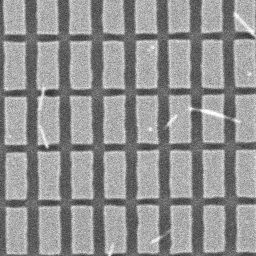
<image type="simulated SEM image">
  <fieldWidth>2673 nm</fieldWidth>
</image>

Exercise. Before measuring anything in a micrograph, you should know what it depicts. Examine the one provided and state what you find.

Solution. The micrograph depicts groups of lines, slits or small figures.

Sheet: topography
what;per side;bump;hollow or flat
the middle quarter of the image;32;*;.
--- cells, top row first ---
..*****...*****...*****...*****.
..*****...*****...*****...*****.
..*****...*****...*****...*****.
..*****...*****...*****...*****.
..*****...*****...*****....****.
..*****...*****...*****....****.
................................
................................
..*****...*****...*****....****.
..*****...*****...*****....*****
..*****...*****...*****....*****
..*****...*****...*****....*****
..*****...*****...*****....*****
..*****...*****...*****....****.
..*****...*****...*****...******
..*****...*****...*****...******
..*****...*****....****....*****
..*****...*****....****....****.
..*****...*****....****....****.
..*****...*****....****....****.
................................
................................
..*****...*****...******...*****
..*****...*****....*****...*****
..*****...*****....****....*****
..*****...*****...*****....*****
..*****...*****...*****....*****
..*****...*****...******...*****
..*****...*****...******...*****
..*****...*****....*****...*****
..*****...*****....*****...*****
..*****...*****....*****...*****